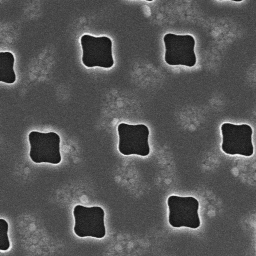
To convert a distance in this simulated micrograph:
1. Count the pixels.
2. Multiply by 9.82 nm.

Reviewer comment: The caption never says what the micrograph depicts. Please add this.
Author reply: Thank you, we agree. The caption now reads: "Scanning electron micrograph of holes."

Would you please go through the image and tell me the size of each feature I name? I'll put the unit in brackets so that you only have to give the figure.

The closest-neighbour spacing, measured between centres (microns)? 0.846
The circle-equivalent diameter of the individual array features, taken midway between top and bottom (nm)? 334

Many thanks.